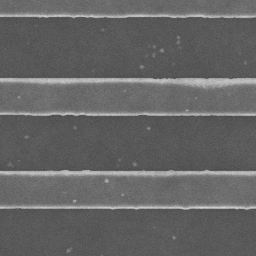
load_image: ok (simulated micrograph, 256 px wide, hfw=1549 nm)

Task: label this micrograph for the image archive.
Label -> lines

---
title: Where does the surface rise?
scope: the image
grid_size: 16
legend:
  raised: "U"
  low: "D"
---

UUUUUUUUUUUUUUUU
DDDDDDDDDDDDDDDD
DDDDDDDDDDDDDDDD
DDDDDDDDDDDDDDDD
DDDDDDDDDDDDDDDD
UUUUUUUUUUUUUUUU
UUUUUUUUUUUUUUUU
DDDDDDDDDDDDDDDD
DDDDDDDDDDDDDDDD
DDDDDDDDDDDDDDDD
DDDDDDDDDDDDDDDD
UUUUUUUUUUUUUUUU
UUUUUUUUUUUUUUUU
DDDDDDDDDDDDDDDD
DDDDDDDDDDDDDDDD
DDDDDDDDDDDDDDDD